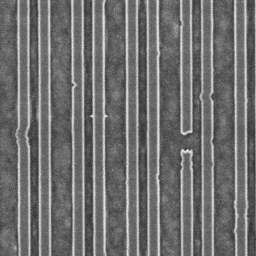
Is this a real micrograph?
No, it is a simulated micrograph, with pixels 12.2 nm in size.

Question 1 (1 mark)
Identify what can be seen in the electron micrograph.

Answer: parallel lines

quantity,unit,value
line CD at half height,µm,0.128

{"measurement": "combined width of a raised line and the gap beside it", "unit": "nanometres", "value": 330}